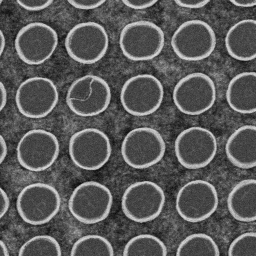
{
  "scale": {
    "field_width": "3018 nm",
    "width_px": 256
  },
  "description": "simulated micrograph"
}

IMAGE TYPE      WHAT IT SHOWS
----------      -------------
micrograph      a regular array of raised bodies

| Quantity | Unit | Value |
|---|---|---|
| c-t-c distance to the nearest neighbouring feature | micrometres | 0.618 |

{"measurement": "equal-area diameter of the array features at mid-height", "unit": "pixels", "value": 39.4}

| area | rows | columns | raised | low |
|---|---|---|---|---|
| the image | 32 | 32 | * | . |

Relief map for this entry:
...***...***....***....**.....**
................................
................................
...***...****...****...***...***
..*****..****..*****..*****.****
..*****.*****..*****..*****.****
..****...****...****..****...***
...***....**....................
................................
........................*.....**
...***...****...****..****...***
*.*****..*****.*****..*****..***
*.*****..*****.*****..*****..***
..****...****...***...****...***
....*...........................
................................
....**....**....***....***....**
...****..****...****..*****..***
*.*****..*****.*****..*****.****
..*****..*****..****..*****..***
...***....***...***....***....**
................................
................................
...***....***...****...****...**
*..****..*****..****..*****..***
*.*****..*****..****..*****..***
*..****..****...****..****...***
...***....**.....*......*.......
................................
........................**....**
...****...****..****...****..***
*..****..*****..*****.*****..***